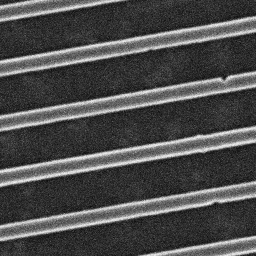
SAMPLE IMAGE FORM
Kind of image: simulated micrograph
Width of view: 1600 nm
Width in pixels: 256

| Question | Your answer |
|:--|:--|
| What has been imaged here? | parallel lines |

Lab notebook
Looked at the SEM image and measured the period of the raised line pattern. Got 0.338 µm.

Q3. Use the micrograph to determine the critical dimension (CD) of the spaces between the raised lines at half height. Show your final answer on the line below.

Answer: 252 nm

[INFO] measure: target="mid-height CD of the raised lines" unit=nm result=89.3